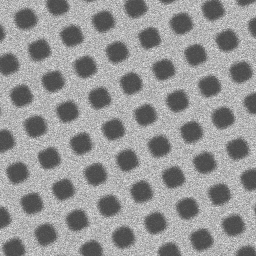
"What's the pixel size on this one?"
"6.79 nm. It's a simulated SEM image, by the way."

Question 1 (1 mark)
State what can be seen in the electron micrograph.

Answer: a regular array of holes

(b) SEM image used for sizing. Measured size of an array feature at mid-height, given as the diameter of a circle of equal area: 0.157 microns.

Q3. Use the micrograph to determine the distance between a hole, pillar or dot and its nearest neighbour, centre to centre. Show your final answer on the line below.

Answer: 231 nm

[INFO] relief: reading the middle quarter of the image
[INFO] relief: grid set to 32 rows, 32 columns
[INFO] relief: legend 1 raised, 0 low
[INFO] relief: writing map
11000000111111111111110000001111
11100000111111111111110000001111
11100000111111100001110000001111
11110011111111000001111000011111
11111111111111000000111111111111
11111111111111000000111111111111
11111110000111100001111111110111
11111100000111100011111111000001
11111100000011111111111110000001
00111100000011111111111110000001
00011110000111111110001111000001
00001111011111111100000111000011
00001111111111111000000111111111
00011111111101111100000111111111
00111111110000011100000111111110
11111111100000011110011111111000
11111111100000011111111111111000
11100011110000011111111111111000
11000001110000111111110000111100
10000001111111111111100000111100
10000001111111111111100000011111
11000001111111100111100000011111
11100111111110000011110000111111
11111111111110000001111011111111
11111111111110000001111111111111
11111100001110000001111111101111
11111000000111000111111110000111
11111000000111111111111100000011
01111000000111111111111100000011
00111100001111111100011110000011
00111110111111111000001110000111
00011111111111110000001111111111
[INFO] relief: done